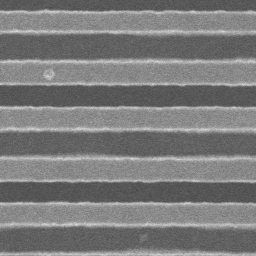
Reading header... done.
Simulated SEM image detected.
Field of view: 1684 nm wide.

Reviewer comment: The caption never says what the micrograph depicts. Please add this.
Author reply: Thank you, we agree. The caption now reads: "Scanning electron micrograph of lines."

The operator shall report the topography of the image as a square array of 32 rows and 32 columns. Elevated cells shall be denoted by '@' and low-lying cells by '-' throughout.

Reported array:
--------------------------------
@@@@@@@@@@@--@@@@@@@@@@@@@@@@-@@
@@@@@@@@@@@@@@@@@@@@@@@@@@@@@@@@
@@@@@@@@@@@@@@@@@@@@@@@@@@@@@@@@
--------------------------------
--------------------------------
--------------------------------
--------------------------------
@@@@@@@@@@@@@@@@@@@@@@@@@@@@@@@@
@@@@@@@@@@@@@@@@@@@@@@@@@@@@@@@@
@@@@@@@@@@@@@@@@@@@@@@@@@@@@@@@@
--------------------------------
--------------------------------
@@@@@@@--@@@@@@@@@@--@@@-@@@@@--
@@@@@@@@@@@@@@@@@@@@@@@@@@@@@@@@
@@@@@@@@@@@@@@@@@@@@@@@@@@@@@@@@
--------------------------------
--------------------------------
--------------------------------
--------------------------------
@@@@@@@@@@@@@@@@@@@@@@@@@@@@@@@@
@@@@@@@@@@@@@@@@@@@@@@@@@@@@@@@@
@@@@@@@@@@@@@@@@@@@@@@@@@@@@@@@@
--------------------------------
--------------------------------
@@@@@@@@@@@@@@@@@@@@@@@@@@@@@@@@
@@@@@@@@@@@@@@@@@@@@@@@@@@@@@@@@
@@@@@@@@@@@@@@@@@@@@@@@@@@@@@@@@
--------------------------------
--------------------------------
--------------------------------
--------------------------------